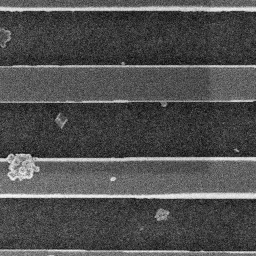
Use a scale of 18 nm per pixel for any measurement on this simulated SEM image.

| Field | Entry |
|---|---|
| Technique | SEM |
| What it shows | lines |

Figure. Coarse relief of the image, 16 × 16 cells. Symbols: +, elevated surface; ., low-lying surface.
++++++++++++++++
................
................
................
++++++++++++++++
++++++++++++++++
................
................
................
................
++++++++++++++++
++++++++++++++++
................
................
................
................